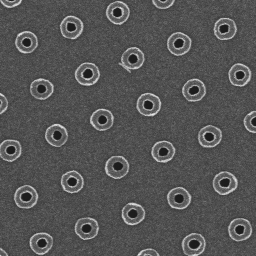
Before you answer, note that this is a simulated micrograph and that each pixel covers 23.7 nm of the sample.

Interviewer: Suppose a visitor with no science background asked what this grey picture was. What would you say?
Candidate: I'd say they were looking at a regular array of ring-shaped raised bodies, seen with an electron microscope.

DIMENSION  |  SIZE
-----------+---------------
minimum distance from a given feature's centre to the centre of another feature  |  1140 nm